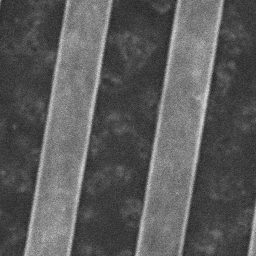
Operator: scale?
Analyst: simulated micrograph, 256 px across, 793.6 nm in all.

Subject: one or a few lines or trenches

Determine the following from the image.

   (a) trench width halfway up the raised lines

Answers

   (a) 0.21 microns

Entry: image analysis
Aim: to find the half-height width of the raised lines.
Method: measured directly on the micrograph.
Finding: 131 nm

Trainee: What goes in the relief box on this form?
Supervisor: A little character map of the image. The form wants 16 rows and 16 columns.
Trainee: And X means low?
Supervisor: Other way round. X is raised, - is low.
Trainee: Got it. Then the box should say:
----XXX----XXX--
----XXX----XXX--
----XXX----XXX--
----XX-----XX---
---XXX----XXX---
---XXX----XXX---
---XXX----XXX---
---XXX----XXX---
---XXX----XXX---
---XX-----XX----
--XXX----XXX----
--XXX----XXX----
--XXX----XXX----
--XXX----XXX----
--XXX----XXX----
--XX-----XX-----